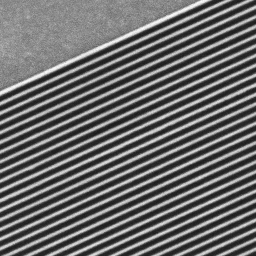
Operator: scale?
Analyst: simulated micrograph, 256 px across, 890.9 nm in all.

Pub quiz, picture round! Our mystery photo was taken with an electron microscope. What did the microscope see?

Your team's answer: parallel lines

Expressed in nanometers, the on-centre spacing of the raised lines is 30.7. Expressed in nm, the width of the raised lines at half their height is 10.3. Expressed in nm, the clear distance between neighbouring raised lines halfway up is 20.2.